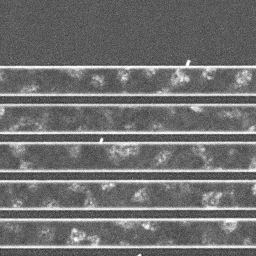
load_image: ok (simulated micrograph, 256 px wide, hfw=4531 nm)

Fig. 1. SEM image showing parallel lines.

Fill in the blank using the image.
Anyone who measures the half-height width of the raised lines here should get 511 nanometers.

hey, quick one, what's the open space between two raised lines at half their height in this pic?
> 162 nm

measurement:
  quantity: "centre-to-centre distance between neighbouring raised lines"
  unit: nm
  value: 674